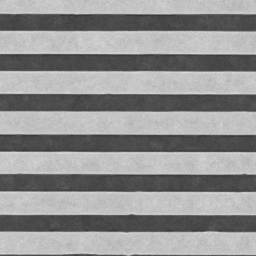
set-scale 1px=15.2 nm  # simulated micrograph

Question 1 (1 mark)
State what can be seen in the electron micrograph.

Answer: parallel lines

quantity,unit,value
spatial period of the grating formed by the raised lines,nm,611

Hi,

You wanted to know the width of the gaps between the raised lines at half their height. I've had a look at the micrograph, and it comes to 259 nanometers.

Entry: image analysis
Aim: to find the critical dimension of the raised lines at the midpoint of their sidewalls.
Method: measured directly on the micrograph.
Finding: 348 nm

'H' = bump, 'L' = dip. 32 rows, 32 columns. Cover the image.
HHHHHHHHHHHHHHHHHHHHHHHHHHHHHHHH
HHHHHHHHHHHHHHHHHHHHHHHHHHHHHHHH
LLLLLLLLLLLLLLLLLLLLLLLLLLLLLLLL
LLLLLLLLLLLLLLLLLLLLLLLLLLLLLLLL
HHHHHHHHHHHHHHHHHHHHHHHHHHHHHHHH
HHHHHHHHHHHHHHHHHHHHHHHHHHHHHHHH
HHHHHHHHHHHHHHHHHHHHHHHHHHHHHHHH
LLLLLLLLLLLLLLLLLLLLLLLLLLLLLLLL
LLLLLLLLLLLLLLLLLLLLLLLLLLLLLLLL
HHHHHHHHHHHHHHHHHHHHHHHHHHHHHHHH
HHHHHHHHHHHHHHHHHHHHHHHHHHHHHHHH
HHHHHHHHHHHHHHHHHHHHHHHHHHHHHHHH
LLLLLLLLLLLLLLLLLLLLLLLLLLLLLLLL
LLLLLLLLLLLLLLLLLLLLLLLLLLLLLLLL
HHHHHHHHHHHHHHHHHHHHHHHHHHHHHHHH
HHHHHHHHHHHHHHHHHHHHHHHHHHHHHHHH
HHHHHHHHHHHHHHHHHHHHHHHHHHHHHHHH
LLLLLLLLLLLLLLLLLLLLLLLLLLLLLLLL
LLLLLLLLLLLLLLLLLLLLLLLLLLLLLLLL
HHHHHHHHHHHHHHHHHHHHHHHHHHHHHHHH
HHHHHHHHHHHHHHHHHHHHHHHHHHHHHHHH
HHHHHHHHHHHHHHHHHHHHHHHHHHHHHHHH
LLLLLLLLLLLLLLLLLLLLLLLLLLLLLLLL
LLLLLLLLLLLLLLLLLLLLLLLLLLLLLLLL
HHHHHHHHHHHHHHHHHHHHHHHHHHHHHHHH
HHHHHHHHHHHHHHHHHHHHHHHHHHHHHHHH
HHHHHHHHHHHHHHHHHHHHHHHHHHHHHHHH
LLLLLLLLLLLLLLLLLLLLLLLLLLLLLLLL
LLLLLLLLLLLLLLLLLLLLLLLLLLLLLLLL
HHHHHHHHHHHHHHHHHHHHHHHHHHHHHHHH
HHHHHHHHHHHHHHHHHHHHHHHHHHHHHHHH
HHHHHHHHHHHHHHHHHHHHHHHHHHHHHHHH